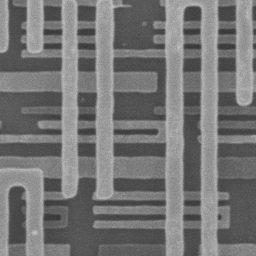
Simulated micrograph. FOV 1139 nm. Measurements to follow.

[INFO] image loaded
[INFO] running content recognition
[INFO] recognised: wiring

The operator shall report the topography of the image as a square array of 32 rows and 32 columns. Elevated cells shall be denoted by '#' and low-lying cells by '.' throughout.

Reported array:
#...#...##..##.......######...#.
#...#...##..##.......##..##...#.
#..##...##..##.......##..##...#.
#..##...##..##.......##..##...##
#..##...##..##.......##..##...##
#..##...##..##.......##..##...##
....#...##..##.......##..##...##
........##..##.......##..##...##
........##..##.......##..##...##
........##..##.......##..##...##
........##..##.......##..##...##
........##..##.......##..##...##
........##..##.......##..##...#.
........##..##.......##..##.....
........##..##.......##..##.....
........##..##.......##..##.....
........##..##.......##..##.....
........##..##.......##..##.....
........##..##.......##..##.....
........##..##.......##..##.....
........##..##.......##..##.....
#####...##..##.......##..##.....
#####...##..##.......##..##.....
#..##...##..##.......##..##.....
#..##...#...##.......##..##.....
#..##................##..##.....
#..##................##..##.....
#..##................##..##.....
#..##................##..##.....
#..##................##..##.....
#..##................##..##.....
#..##................##..##.....